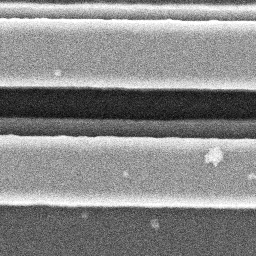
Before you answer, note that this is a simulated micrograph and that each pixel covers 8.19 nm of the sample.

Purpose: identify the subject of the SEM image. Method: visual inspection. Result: lines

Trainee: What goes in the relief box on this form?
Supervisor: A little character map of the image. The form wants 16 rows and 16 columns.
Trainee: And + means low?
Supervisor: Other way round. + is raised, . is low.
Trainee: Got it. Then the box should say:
+++.............
++++++++++++++++
++++++++++++++++
++++++++++++++++
++++++++++++++++
............++++
................
................
++++++++++++++++
++++++++++++++++
++++++++++++++++
++++++++++++++++
++++++++++++++++
................
................
................